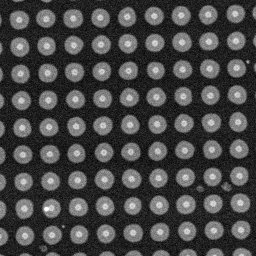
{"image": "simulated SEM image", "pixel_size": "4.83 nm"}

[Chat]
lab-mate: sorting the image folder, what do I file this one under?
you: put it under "an array of small figures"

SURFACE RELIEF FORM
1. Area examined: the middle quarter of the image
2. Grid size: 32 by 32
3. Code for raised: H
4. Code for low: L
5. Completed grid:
LHHHHLLLHHHLLLHHHHLLLHHHHLLLHHHH
HHHHHLLHHHHHLLHHHHLLLHHHHLLHHHHH
HHHHHLLHHHHHLLHHHHLLLHHHHLLLHHHH
LHHHLLLLHHHLLLLHHHLLLLHHLLLLLHLL
LLLLLLLLLLLLLLLLLLLLLLLLLLLLLLLL
LLLLLLLLLLLLLLLLLLLLLLLLLLLLLLLL
LLLLLLLLLHHLLLLHHLLLLLHHLLLLHHHL
LHHHHLLLHHHHLLHHHHLLLHHHHLLLHHHH
LHHHHLLHHHHHLLHHHHHLLHHHHLLLHHHH
LHHHHLLHHHHHLLHHHHLLLHHHHLLLHHHH
LHHHHLLLHHHLLLLHHLLLLLLHLLLLLLLL
LLLLLLLLLLLLLLLLLLLLLLLLLLLLLLLL
LLLLLLLLLLLLLLLLLLLLLLLLLLLLLLLL
LLHHLLLLLHHLLLLHHHLLLLHHHLLLHHHH
LHHHHLLLHHHHLLHHHHHLLHHHHLLLHHHH
LHHHHLLHHHHHLLHHHHHLLHHHHHLLHHHH
LHHHHLLLHHHHLLLHHHLLLLHHHLLLHHHL
LLHHLLLLLHHLLLLLLLLLLLLLLLLLLLLL
LLLLLLLLLLLLLLLLLLLLLLLLLLLLLLLL
LLLLLLLLLLLLLLLLLLLLLLLLLLLLLHHL
LLHHLLLLHHHHLLLHHHHLLLHHHLLLHHHH
LHHHHLLLHHHHLLHHHHHLLHHHHHLLHHHH
LHHHHLLLHHHHLLHHHHHLLHHHHHLLHHHH
LHHHHLLLHHHHLLLHHHHLLLHHHLLLLHHL
LLHHLLLLLHHLLLLLLLLLLLLLLLLLLLLL
LLLLLLLLLLLLLLLLLLLLLLLLLLLLLLLL
LLLLLLLLLHHLLLLLHLLLLLLHHLLLLHHH
LLHHHLLLHHHHLLLHHHHLLLHHHHLLHHHH
LHHHHHLLHHHHLLLHHHHLLHHHHHLLHHHH
LHHHHHLLHHHHLLLHHHHLLLHHHHLLHHHH
LHHHHLLLHHHHLLLHHHHLLLHHHLLLLHHL
LLLLLLLLLLLLLLLLLLLLLLLLLLLLLLLL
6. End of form